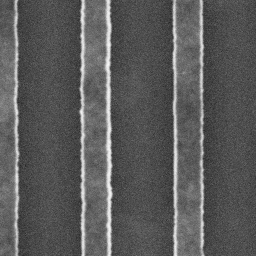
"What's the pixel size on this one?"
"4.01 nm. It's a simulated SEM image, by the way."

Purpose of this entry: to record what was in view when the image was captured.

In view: lines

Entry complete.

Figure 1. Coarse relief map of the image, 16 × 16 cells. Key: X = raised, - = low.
X----XX----XX---
X----XX----XX---
X----XX----XX---
X----XX----XX---
X----XX----XX---
X----XX----XX---
X----XX----XX---
X----XX----XX---
X----XX----XX---
X----XX----XX---
X----XX----XX---
X----XX----XX---
X----XX----XX---
X----XX----XX---
X----XX----XX---
X----XX----XX---